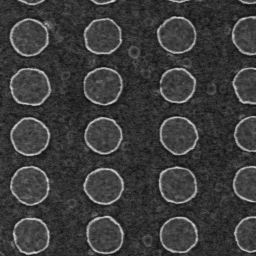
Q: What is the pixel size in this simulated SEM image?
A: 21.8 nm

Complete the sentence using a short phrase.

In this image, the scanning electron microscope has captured a regular array of raised bodies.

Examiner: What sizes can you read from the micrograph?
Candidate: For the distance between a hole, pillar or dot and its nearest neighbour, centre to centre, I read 1080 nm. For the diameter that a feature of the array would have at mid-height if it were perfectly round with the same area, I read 790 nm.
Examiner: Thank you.